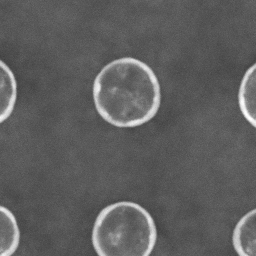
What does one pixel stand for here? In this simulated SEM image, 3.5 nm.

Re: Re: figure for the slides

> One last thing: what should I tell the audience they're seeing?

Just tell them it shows raised bodies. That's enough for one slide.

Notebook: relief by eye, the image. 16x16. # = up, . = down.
................
................
................
................
#.....###.......
#.....####.....#
#.....####.....#
.......##.......
................
................
................
................
................
#.....###......#
#.....####.....#
#.....###......#